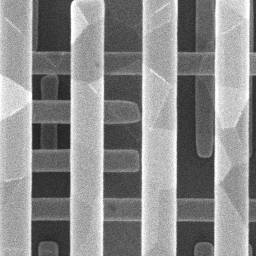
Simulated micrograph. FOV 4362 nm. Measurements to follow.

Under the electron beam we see wiring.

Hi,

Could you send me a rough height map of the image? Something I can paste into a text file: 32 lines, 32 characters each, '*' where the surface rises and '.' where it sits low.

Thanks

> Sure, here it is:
****.....****.....****.....****.
****.....****.....****.....****.
****.....****.....****.....****.
****.....****.....****.....****.
****.....****.....****.....****.
****.....****.....****.....****.
**************...******...******
********************************
********************************
****.....****.....****.....****.
****.....****.....****.....****.
****.....****.....****.....****.
****.....****.....****.....****.
*****************.****.....****.
**********************.....****.
****....*****.....****.....****.
****.....****.....****.....****.
****.....****.....****.....****.
****....*****.....****.....****.
**********************.....****.
**********************.....****.
****....*****.....****.....****.
****.....****.....****.....****.
****.....****.....****.....****.
****.....****.....****.....****.
********************************
********************************
********************************
****.....****.....****.....****.
****.....****.....****.....****.
****.....****.....****.....****.
****.....****.....****.....****.